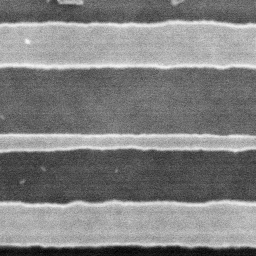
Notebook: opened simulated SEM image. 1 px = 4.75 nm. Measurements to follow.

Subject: lines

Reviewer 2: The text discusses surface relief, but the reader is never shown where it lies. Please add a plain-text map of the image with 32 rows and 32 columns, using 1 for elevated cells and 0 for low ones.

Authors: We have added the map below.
00000000000000000000000000000000
00000000000000000000000000000000
00000000000000000000000000000000
11111111111111111111111111111111
11111111111111111111111111111111
11111111111111111111111111111111
11111111111111111111111111111111
11111111111111111111111111111111
00000000000000000000000000000000
00000000000000000000000000000000
00000000000000000000000000000000
00000000000000000000000000000000
00000000000000000000000000000000
00000000000000000000000000000000
00000000000000000000000000000000
00000000000000000000000000000000
00000000000000000000000000000000
11111111111111111111111111111111
11111111110111100111111111111111
00000000000000000000000000000000
00000000000000000000000000000000
00000000000000000000000000000000
00000000000000000000000000000000
00000000000000000000000000000000
00000000000000000000000000000000
11100000011001111111110000111110
11111111111111111111111111111111
11111111111111111111111111111111
11111111111111111111111111111111
11111111111111111111111111111111
11111111111111111111111111111111
00000000000000000000000000000000